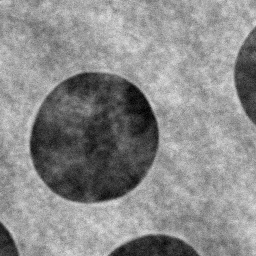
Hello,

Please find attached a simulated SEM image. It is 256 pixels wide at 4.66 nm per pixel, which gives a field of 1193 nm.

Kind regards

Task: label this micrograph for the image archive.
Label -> holes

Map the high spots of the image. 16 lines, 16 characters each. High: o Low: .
oooooooooooooooo
oooooooooooooooo
ooooooooooooooo.
ooooooooooooooo.
ooooooooooooooo.
ooo......oooooo.
ooo......oooooo.
oo........oooooo
oo........oooooo
oo........oooooo
oo.......ooooooo
ooo......ooooooo
oooo...ooooooooo
oooooooooooooooo
.ooooooooooooooo
.oooooo.....oooo